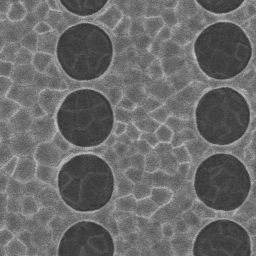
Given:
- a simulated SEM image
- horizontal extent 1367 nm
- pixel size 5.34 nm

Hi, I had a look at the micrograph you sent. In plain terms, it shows holes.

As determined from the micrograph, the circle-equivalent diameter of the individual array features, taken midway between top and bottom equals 305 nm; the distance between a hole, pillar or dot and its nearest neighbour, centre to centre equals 350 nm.